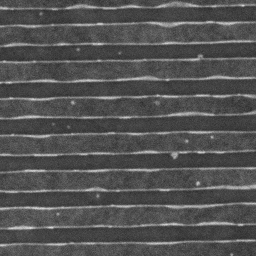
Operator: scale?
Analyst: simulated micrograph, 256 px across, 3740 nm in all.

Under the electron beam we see groups of lines, slits or small figures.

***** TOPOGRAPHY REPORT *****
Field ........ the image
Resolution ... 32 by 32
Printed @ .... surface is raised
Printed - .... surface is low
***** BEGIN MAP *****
@@@@@@@@@@@@@@@@@@@@@@@@@@@@@@@@
--------------------------------
--------------------------------
@@@@@@@@@@@@@@@@@@@@@@@@@@@@@@@@
@@@@@@@@@@@@@@@@@@@@@@@@@@@@@@@@
@@@@@@@@@@----------------------
--------------------------------
------------------------@@@@@@@@
@@@@@@@@@@@@@@@@@@@@@@@@@@@@@@@@
@@@@@@@@@@@@@@@@@@@@@@@@@@@@@@@@
--------------------------------
--------------------------------
@@@@@@@@@@@@@@@@@@@@@@@@@@@@@@@@
@@@@@@@@@@@@@@@@@@@@@@@@@@@@@@@@
@@@@@@@@@@@@@@@@@@@@@-----------
--------------------------------
----------------------@@--@@@@-@
@@@@@@@@@@@@@@@@@@@@@@@@@@@@@@@@
@@@@@@@@@@@@@@@@@@@@@@@@@@@@@@@@
--------------------------------
--------------------------------
--@@@@@@@@@@@@@@@@@@@@@@@@@@@@@@
@@@@@@@@@@@@@@@@@@@@@@@@@@@@@@@@
@@@@@@@@@@@@@@@@@@@@@@@@@@------
--------------------------------
-----------------------------@@-
@@@@@@@@@@@@@@@@@@@@@@@@@@@@@@@@
@@@@@@@@@@@@@@@@@@@@@@@@@@@@@@@@
@@@@@---------------------------
--------------------------------
--@@----@@@@@@@@@@@@@@@@@@@@@@@@
@@@@@@@@@@@@@@@@@@@@@@@@@@@@@@@@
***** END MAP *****